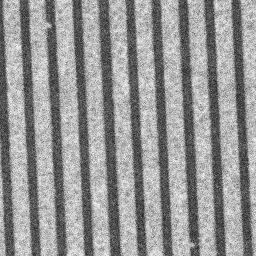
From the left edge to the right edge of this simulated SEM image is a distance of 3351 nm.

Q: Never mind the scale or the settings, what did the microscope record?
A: parallel lines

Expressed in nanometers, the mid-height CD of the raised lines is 216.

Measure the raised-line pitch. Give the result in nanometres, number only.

345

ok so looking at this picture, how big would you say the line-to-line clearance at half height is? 126 nm